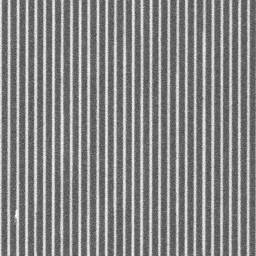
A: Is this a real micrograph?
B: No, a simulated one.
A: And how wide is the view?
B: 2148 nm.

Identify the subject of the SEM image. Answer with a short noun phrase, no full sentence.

parallel lines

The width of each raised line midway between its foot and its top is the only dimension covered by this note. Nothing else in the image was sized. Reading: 15.7 nanometers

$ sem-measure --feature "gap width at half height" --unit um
0.0608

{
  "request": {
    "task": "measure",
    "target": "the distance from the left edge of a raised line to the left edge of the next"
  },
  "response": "74.3 nanometers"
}